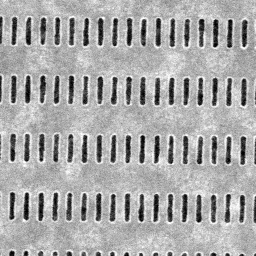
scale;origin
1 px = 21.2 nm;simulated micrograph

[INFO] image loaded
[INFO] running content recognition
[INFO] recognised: a regular array of holes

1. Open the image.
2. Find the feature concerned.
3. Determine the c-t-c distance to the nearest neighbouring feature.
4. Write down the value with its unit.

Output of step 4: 0.303 um